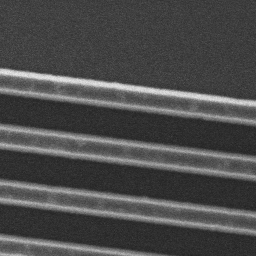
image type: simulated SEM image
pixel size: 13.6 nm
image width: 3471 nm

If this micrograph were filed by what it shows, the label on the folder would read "parallel lines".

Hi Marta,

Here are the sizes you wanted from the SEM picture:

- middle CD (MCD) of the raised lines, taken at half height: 0.266 microns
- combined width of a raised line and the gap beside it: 741 nanometers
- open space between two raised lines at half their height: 476 nanometers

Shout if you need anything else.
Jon